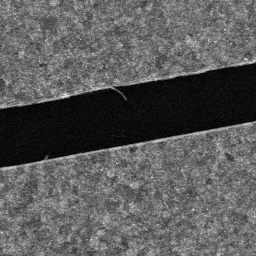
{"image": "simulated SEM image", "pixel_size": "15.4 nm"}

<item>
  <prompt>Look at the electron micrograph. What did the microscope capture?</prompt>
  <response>one or a few lines or trenches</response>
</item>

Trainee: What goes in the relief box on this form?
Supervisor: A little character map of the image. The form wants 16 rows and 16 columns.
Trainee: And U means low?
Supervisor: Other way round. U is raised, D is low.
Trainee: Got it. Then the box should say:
UUUUUUUUUUUUUUUU
UUUUUUUUUUUUUUUU
UUUUUUUUUUUUUUUU
UUUUUUUUUUUUUUUU
UUUUUUUUUUUUDDDD
UUUUUUDDDDDDDDDD
UDDDDDDDDDDDDDDD
DDDDDDDDDDDDDDDD
DDDDDDDDDDDDUUUU
DDDDDDUUUUUUUUUU
DUUUUUUUUUUUUUUU
UUUUUUUUUUUUUUUU
UUUUUUUUUUUUUUUU
UUUUUUUUUUUUUUUU
UUUUUUUUUUUUUUUU
UUUUUUUUUUUUUUUU